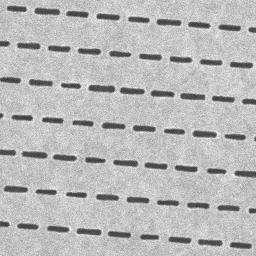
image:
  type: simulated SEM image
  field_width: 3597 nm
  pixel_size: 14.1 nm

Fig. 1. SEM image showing a regular array of holes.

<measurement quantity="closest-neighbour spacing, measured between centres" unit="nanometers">426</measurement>